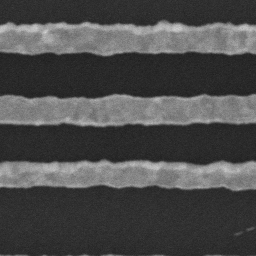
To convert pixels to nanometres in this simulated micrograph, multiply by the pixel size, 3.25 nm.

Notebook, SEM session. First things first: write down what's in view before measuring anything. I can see lines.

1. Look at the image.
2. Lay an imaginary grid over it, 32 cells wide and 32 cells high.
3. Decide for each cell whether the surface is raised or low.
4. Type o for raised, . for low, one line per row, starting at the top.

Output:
................................
................................
................................
ooooooooooooooooo..ooooo.ooooooo
oooooooooooooooooooooooooooooooo
oooooooooooooooooooooooooooooooo
.ooooooooo.ooooo.ooo.oo..ooooooo
................................
................................
................................
................................
................................
oooooooooooooooooooooooooooooooo
oooooooooooooooooooooooooooooooo
oooooooooooooooooooooooooooooooo
....o.....ooooo...o.............
................................
................................
................................
................................
..........oooo.oooo.o......o..oo
oooooooooooooooooooooooooooooooo
oooooooooooooooooooooooooooooooo
.......................o.....ooo
................................
................................
................................
................................
................................
................................
................................
................................